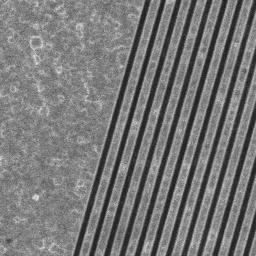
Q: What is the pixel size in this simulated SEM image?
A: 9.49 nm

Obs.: parallel lines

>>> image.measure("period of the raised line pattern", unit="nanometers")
141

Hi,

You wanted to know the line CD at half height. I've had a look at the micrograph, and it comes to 83.4 nm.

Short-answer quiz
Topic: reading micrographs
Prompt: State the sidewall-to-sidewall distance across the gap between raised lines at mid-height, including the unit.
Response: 55.9 nm